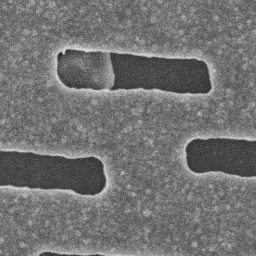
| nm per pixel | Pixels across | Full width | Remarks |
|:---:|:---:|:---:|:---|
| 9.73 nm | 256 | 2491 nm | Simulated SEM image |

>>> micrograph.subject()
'holes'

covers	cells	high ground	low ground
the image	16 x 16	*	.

****************
****************
****************
****.....*******
****.........***
*****........***
****************
****************
****************
..**********....
......******....
.......*********
****************
****************
****************
****************